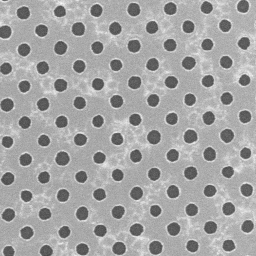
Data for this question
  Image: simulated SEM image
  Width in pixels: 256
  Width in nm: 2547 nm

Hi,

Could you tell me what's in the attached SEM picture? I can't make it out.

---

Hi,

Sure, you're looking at a regular array of holes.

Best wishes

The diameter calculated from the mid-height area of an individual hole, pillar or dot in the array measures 0.132 um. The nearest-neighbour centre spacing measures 255 nanometres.